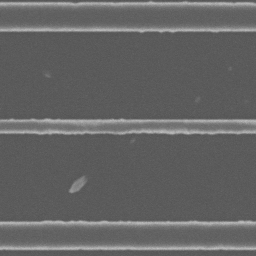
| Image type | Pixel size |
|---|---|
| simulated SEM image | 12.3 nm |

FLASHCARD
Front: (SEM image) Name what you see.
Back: lines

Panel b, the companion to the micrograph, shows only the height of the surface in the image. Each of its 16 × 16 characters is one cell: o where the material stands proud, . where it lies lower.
oooooooooooooooo
oooooooooooooooo
................
................
................
................
................
................
................
................
................
................
................
................
oooooooooooooooo
oooooooooooooooo